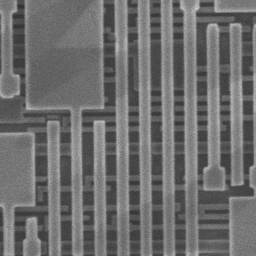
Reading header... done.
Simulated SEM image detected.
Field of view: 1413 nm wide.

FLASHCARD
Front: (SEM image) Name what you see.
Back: wiring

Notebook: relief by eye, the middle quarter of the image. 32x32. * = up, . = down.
**********...***...**....**...**
**********...***...**....**...**
**********...***...**....**...**
**********...***...**....**...**
**********...***...**....**...**
**********...***...**....**...**
**********...***...**....**...**
**********...***...**....**...**
**********...***...**....**...**
**********...***...**....**...**
**********...***...**....**...**
.***.........***...**....**...**
..**.........***...**....**...**
..**.........***...**....**...**
..**....**...***...**....**...**
..**....**...***...**....**...**
..**....**...***...**....**...**
..**....**...***...**....**...**
..**....**...***...***...**...**
..**....**...***...***...**...**
..**....**...***...***...**...**
..**....**...***...***...**...**
..**....**...***...***...**...**
..**....**...***...***...**...**
..**....**...***...***...**...**
..**....**...***...***...**...**
..**....**...***...***...**....*
..**....**...***...***...**....*
..**....**...***...***...***...*
..**....**...***...***...***...*
..**....**...***...***...***...*
..**....**...***...***...***...*